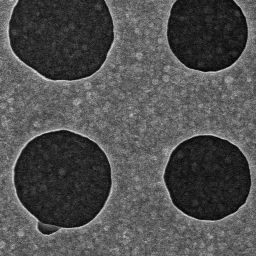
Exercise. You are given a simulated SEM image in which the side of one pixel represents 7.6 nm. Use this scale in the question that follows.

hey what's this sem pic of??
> holes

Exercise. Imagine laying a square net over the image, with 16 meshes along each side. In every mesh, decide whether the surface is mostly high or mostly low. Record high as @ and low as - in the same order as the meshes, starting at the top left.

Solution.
@------@@@@----@
@------@@@-----@
@------@@@-----@
@------@@@@----@
@@----@@@@@@@@@@
@@@@@@@@@@@@@@@@
@@@@@@@@@@@@@@@@
@@@@@@@@@@@@@@@@
@@---@@@@@@@-@@@
@-----@@@@@----@
@------@@@------
@------@@@------
@------@@@@----@
@@----@@@@@@--@@
@@@@@@@@@@@@@@@@
@@@@@@@@@@@@@@@@